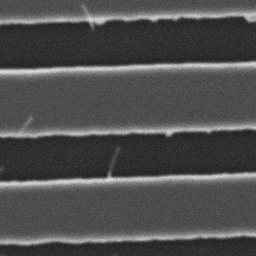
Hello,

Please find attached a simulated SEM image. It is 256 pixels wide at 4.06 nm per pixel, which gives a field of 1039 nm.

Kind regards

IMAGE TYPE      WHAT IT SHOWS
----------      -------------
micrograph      lines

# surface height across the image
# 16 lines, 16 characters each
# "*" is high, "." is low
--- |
****************
................
................
................
****************
****************
****************
****************
**..............
................
................
****************
****************
****************
****************
................